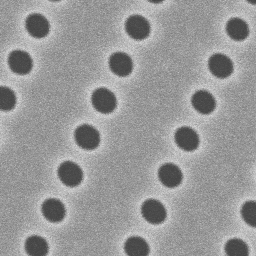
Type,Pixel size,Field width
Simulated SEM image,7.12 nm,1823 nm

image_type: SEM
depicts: a regular array of holes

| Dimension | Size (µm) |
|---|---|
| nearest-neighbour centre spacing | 0.285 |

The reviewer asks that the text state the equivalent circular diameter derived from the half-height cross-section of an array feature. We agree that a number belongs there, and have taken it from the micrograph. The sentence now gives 0.187 µm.